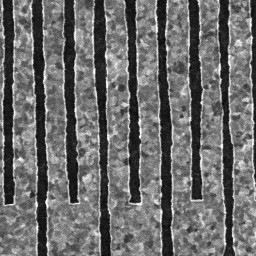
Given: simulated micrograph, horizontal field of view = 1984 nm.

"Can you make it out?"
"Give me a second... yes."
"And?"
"parallel lines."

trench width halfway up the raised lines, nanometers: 82.4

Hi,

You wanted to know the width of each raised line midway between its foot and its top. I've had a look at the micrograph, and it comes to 157 nm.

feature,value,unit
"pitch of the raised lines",31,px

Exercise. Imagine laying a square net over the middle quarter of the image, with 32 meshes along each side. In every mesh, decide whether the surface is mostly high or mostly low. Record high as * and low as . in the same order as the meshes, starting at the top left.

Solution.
...****....*****..*****...*****.
...*****...*****..*****...*****.
...*****...*****..*****...*****.
...*****...*****...****...*****.
...*****...*****...****...*****.
...*****...*****...****....****.
...*****...*****...****...*****.
...*****...*****..******..*****.
...*****...*****..******..******
...*****...*****...*****...*****
...*****...*****...*****...****.
...*****...*****...*****...****.
...*****...*****...*****...****.
...*****...*****...*****...****.
...*****...*****...*****...****.
*..*****...*****...*****...*****
...******..*****...*****...*****
...******..*****...*****...*****
...******..*****...*****...*****
....*****..*****...*****...*****
...******..*****...*****...*****
...******..*****...*****...*****
....*****..*****...*****...*****
...******..*****...*****...*****
....*****..*****...*****...*****
....*****..*****...*****...*****
*...*****..*****...*****...*****
*..******..*****...*****...*****
*..******..*****...*****...*****
*...*****..*****...*****...*****
*...*****..*****...*****...*****
*...*****..*****...*****...*****